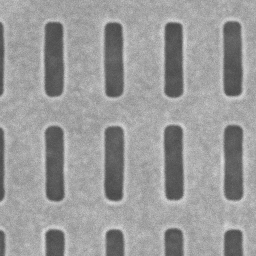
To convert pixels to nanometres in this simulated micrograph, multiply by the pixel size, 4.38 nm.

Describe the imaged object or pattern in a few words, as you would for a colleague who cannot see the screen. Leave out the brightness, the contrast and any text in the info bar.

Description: a regular array of holes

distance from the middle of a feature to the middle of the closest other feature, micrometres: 0.26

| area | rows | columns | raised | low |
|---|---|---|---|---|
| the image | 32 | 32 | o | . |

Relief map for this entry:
oooooooooooooooooooooooooooooooo
oooooooooooooooooooooooooooooooo
oooooooooooooooooooooooooooooooo
oooooo..ooooo..oooooo..ooooo..oo
.ooooo..ooooo..ooooo...ooooo..oo
.ooooo..ooooo..oooooo..ooooo..oo
.ooooo..ooooo..ooooo...ooooo..oo
.ooooo..ooooo...oooo...ooooo..oo
.ooooo..ooooo...oooo...ooooo..oo
.ooooo..ooooo...oooo...ooooo..oo
.ooooo..ooooo...oooo...ooooo..oo
oooooo..ooooo..oooooo..ooooo..oo
oooooooooooooooooooooooooooooooo
oooooooooooooooooooooooooooooooo
oooooooooooooooooooooooooooooooo
oooooooooooooooooooooooooooooooo
oooooo..ooooo..oooooo..ooooo..oo
.ooooo..ooooo..oooooo..ooooo..oo
.ooooo..ooooo...ooooo..ooooo..oo
.ooooo..ooooo..oooooo..ooooo..oo
.ooooo..ooooo..oooooo..ooooo..oo
.ooooo..ooooo..oooooo..ooooo..oo
oooooo..ooooo..oooooo..ooooo..oo
.ooooo..ooooo..oooooo..ooooo..oo
oooooo..ooooo..oooooo..ooooo..oo
oooooooooooooooooooooooooooooooo
oooooooooooooooooooooooooooooooo
oooooooooooooooooooooooooooooooo
oooooooooooooooooooooooooooooooo
.ooooo..ooooo...ooooo..ooooo..oo
.ooooo..ooooo...ooooo..ooooo..oo
.ooooo..ooooo...ooooo..ooooo..oo